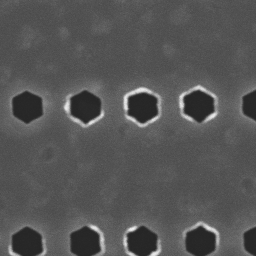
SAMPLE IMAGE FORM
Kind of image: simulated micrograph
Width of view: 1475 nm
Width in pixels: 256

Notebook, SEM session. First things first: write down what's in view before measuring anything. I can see holes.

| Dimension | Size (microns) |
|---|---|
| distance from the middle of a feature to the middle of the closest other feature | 0.325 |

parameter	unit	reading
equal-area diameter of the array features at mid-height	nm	180